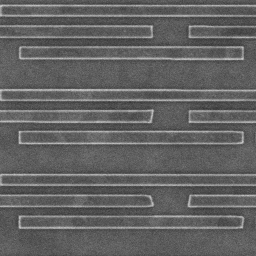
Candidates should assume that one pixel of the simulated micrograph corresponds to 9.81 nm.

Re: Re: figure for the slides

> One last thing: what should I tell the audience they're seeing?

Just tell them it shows wiring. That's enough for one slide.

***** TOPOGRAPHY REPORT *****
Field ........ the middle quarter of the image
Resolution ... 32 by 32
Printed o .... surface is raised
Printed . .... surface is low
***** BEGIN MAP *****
................................
................................
................................
................................
................................
................................
ooooooooooooooooooooooooooooo...
oooooooooooooooooooooooooooooooo
oooooooooooooooooooooooooooooooo
................................
................................
................................
oooooooooooooooooooooo.........o
oooooooooooooooooooooo.........o
oooooooooooooooooooooo.........o
................................
................................
oooooooooooooooooooooooooooooooo
oooooooooooooooooooooooooooooooo
oooooooooooooooooooooooooooooooo
................................
................................
................................
................................
................................
................................
................................
................................
oooooooooooooooooooooooooooooooo
oooooooooooooooooooooooooooooooo
................................
................................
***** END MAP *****